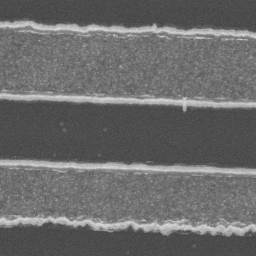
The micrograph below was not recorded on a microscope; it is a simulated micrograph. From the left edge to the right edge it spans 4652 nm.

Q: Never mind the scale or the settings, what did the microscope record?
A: one or a few lines or trenches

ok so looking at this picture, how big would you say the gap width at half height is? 64.8 pixels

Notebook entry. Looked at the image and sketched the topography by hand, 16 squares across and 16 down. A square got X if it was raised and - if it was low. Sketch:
----------------
-X--------------
XXXXXXXXXXXXXXXX
XXXXXXXXXXXXXXXX
XXXXXXXXXXXXXXXX
XXXXXXXXXXXXXXXX
-----------XXXXX
----------------
----------------
----------------
XXXXXXXXXX------
XXXXXXXXXXXXXXXX
XXXXXXXXXXXXXXXX
XXXXXXXXXXXXXXXX
----------------
----------------